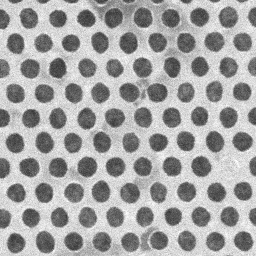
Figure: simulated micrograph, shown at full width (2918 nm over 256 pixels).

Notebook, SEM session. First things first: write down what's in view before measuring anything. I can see a regular array of holes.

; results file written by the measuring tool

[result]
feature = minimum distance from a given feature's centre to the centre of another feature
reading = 0.315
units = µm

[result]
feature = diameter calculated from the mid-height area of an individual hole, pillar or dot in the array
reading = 225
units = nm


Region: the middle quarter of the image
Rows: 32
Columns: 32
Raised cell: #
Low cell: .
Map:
.##.....##.....##.....###....###
.###....###....##.....###....###
.###....###....###....####...###
###################.#######.####
################################
#...###....###....###....####...
....###....###.....##.....###...
.....##.....##.....##.....##....
....###....###.....##....####...
#...####..######.######.######..
################################
####...####...####...####....###
####....##.....##.....###....###
.##.....##.....##.....##.....###
.##.....###....###....###....###
####....###...#####..#####..####
#####.##########################
#..#####...####...####...####...
.....##.....###...###.....##....
.....##.....##.....##.....##....
.....##.....###....##.....###...
....####...####...####...####...
################################
#####..#####..#####..#####..####
####....###....###....###....###
.##.....##.....##.....###....###
.##.....###....###....###....###
.###....###....###....####...###
################################
########...#####.######.######.#
#...###....####...####...####...
.....##.....##.....##.....##....